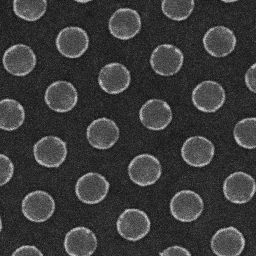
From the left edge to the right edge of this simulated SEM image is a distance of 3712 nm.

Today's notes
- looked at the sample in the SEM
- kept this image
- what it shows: a regular array of raised bodies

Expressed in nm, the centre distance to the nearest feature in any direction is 802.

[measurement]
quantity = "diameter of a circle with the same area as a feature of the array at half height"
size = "454 nm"